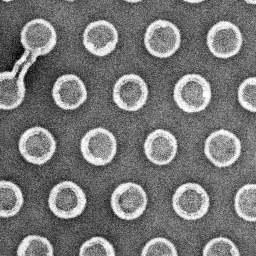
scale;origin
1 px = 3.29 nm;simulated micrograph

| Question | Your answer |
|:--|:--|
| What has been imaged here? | a regular array of raised bodies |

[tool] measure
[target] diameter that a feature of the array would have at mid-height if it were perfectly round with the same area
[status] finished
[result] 110 nm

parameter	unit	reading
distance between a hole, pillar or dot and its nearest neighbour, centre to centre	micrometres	0.203